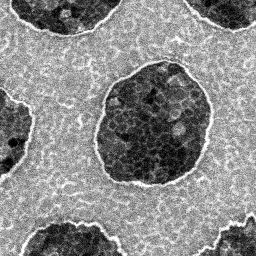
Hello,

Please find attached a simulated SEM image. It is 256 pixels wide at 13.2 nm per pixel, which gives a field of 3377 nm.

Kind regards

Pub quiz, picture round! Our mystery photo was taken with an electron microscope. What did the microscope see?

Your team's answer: raised bodies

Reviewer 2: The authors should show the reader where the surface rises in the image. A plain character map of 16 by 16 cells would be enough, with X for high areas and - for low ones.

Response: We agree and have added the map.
-XXXXXX-----XXXX
--XXXX-------XXX
----------------
----------------
--------XXXX----
-------XXXXXX---
X------XXXXXX---
XX----XXXXXXX---
XX----XXXXXXX---
XX----XXXXXXX---
X------XXXXX----
---------X------
----------------
----------------
--XXXXX-------XX
--XXXXXX-----XXX